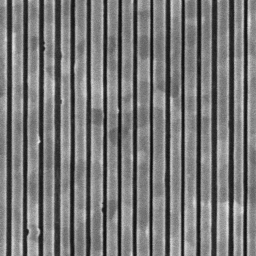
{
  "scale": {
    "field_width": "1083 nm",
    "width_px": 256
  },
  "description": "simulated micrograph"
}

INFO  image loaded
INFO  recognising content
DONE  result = parallel lines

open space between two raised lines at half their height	0.0217	µm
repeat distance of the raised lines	66.9	nm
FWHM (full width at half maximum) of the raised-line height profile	47.1	nm